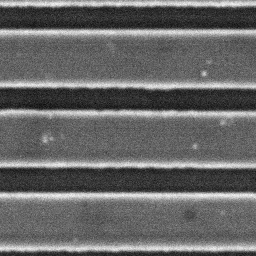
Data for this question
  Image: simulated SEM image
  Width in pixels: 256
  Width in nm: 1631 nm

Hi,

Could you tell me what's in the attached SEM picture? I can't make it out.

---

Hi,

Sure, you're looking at lines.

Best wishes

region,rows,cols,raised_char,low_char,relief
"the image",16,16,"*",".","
................
................
****************
****************
****************
................
................
****************
****************
****************
................
................
****************
****************
****************
****************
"